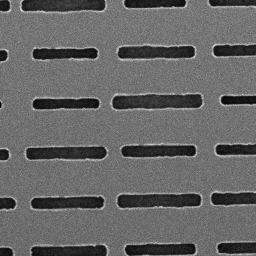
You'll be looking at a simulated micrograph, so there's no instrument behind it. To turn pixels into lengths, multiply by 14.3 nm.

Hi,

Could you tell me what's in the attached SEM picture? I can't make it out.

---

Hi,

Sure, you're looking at a regular array of holes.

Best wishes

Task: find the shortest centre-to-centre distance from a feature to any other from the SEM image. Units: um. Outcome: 0.706